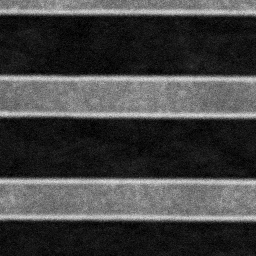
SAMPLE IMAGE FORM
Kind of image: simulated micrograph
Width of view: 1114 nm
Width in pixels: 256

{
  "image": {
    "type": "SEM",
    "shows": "one or a few lines or trenches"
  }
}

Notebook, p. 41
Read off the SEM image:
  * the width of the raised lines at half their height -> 154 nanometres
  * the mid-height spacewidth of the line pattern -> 293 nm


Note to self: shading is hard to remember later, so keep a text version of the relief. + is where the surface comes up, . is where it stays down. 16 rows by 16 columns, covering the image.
++++++++++++++++
................
................
................
................
++++++++++++++++
++++++++++++++++
................
................
................
................
++++++++++++++++
++++++++++++++++
++++++++++++++++
................
................